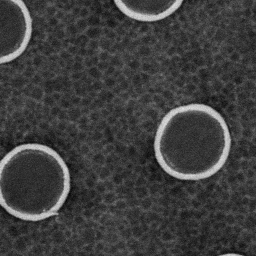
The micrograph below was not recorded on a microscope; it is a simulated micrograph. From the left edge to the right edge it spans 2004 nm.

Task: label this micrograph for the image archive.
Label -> raised bodies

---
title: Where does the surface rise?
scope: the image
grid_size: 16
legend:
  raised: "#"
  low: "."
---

#.......###.....
##..............
##..............
#...............
................
................
................
..........####..
..........####..
.##.......####..
####......###...
####............
####............
.##.............
................
................